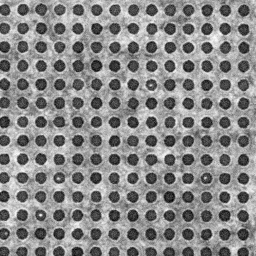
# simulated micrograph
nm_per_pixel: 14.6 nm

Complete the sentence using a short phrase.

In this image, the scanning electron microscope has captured a regular array of holes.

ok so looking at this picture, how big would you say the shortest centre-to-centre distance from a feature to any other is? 266 nm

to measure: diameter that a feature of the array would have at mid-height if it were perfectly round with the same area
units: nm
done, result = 184